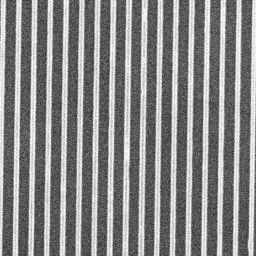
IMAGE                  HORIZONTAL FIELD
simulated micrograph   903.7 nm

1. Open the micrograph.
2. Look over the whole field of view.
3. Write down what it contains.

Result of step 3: parallel lines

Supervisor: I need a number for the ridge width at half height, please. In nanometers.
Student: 13.2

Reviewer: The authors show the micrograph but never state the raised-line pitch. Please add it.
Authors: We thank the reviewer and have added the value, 55.4 nanometres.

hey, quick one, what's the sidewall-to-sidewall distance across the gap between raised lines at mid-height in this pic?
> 11.2 px